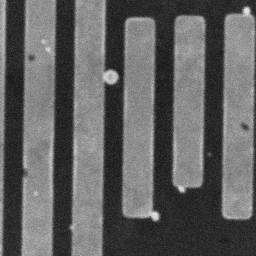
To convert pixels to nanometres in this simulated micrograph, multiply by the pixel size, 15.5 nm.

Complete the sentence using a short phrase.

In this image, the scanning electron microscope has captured groups of lines, slits or small figures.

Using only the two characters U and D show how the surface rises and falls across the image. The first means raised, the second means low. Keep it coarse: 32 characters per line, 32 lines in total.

UDDUUUUDDDUUUDDDDDDDDDDDDDDDDDDD
UDDUUUUDDUUUUDDDDDDDDDDDDDDDDDUD
DDDUUUUDDUUUUDDDUUUDDDUUUDDDUUUU
DDDUUUUDDUUUUDDDUUUDDDUUUUDDUUUU
DDDUUUUDDUUUUDDDUUUDDDUUUUDDUUUU
DDDUUUUDDUUUUDDDUUUDDDUUUUDDUUUU
DDDUUUUDDUUUUDDDUUUDDDUUUDDDUUUU
DDDUUUUDDUUUUDDDUUUDDDUUUDDDUUUU
DDDUUUUDDUUUUDDDUUUDDDUUUDDDUUUU
DDDUUUUDDUUUUUUDUUUDDDUUUDDDUUUU
DDDUUUUDDUUUUDDDUUUDDDUUUDDDUUUU
DDDUUUUDDUUUUDDDUUUDDDUUUDDDUUUU
DDDUUUUDDUUUUDDDUUUDDDUUUDDDUUUU
DDDUUUUDDUUUUDDDUUUDDDUUUDDDUUUU
DDDUUUUDDUUUUDDDUUUDDDUUUDDDUUUU
DDDUUUUDDUUUUDDDUUUDDDUUUDDDUUUU
DDDUUUUDDUUUUDDDUUUDDDUUUDDDUUUU
DDDUUUUDDUUUUDDUUUUDDDUUUDDDUUUU
DDDUUUDDDUUUUDDUUUUDDDUUUDDDUUUU
DDDUUUDDDUUUUDDUUUUDDDUUUDDDUUUU
DDDUUUDDDUUUUDDUUUUDDDUUUDDDUUUU
DDDUUUDDDUUUUDDUUUUDDDUUUDDDUUUU
DDDUUUDDDUUUUDDUUUUDDDUUUDDDUUUU
DDDUUUDDDUUUUDDUUUUDDDUDDDDDUUUU
DDDUUUDDDUUUUDDUUUUDDDDDDDDDUUUD
DDDUUUDDDUUUUDDUUUUDDDDDDDDDUUUD
DDDUUUDDDUUUUDDUUUUDDDDDDDDDUUUD
DDDUUUDDDUUUUDDDDDDDDDDDDDDDDDDD
DDDUUUDDDUUUUDDDDDDDDDDDDDDDDDDD
DDDUUUDDDUUUUDDDDDDDDDDDDDDDDDDD
DDDUUUDDDUUUUDDDDDDDDDDDDDDDDDDD
DDDUUUDDDUUUUDDDDDDDDDDDDDDDDDDD